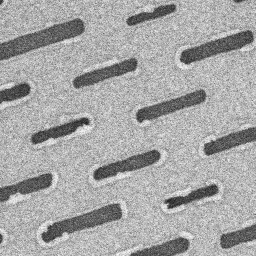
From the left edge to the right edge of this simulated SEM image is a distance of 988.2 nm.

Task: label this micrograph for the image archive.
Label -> a regular array of holes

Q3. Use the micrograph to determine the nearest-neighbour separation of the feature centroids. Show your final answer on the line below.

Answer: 283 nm